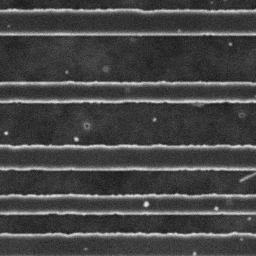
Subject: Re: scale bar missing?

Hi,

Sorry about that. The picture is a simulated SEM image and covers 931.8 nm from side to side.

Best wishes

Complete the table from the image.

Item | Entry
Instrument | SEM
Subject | lines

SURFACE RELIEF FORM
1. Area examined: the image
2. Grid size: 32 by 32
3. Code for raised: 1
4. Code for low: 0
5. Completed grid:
00000000000000000000000000000000
11111111111111111111111111111111
11111111111111111111111111111111
11111111111111111111111111111111
00000000000000000000000000000000
00000000000000000000000000000000
00000000000000000000000000000000
00000000000000000000000000000000
00000000000000000000000000000000
00000000000000000000000000000000
11111111111111111111111111111111
11111111111111111111111111111111
11111111111111111111111111111111
00000000000000000000000000000000
00000000000000000000000000000000
00000000000000000000000000000000
00000000000000000000000000000000
00000000000000000000000000000000
11111111111111111111111111111111
11111111111111111111111111111111
11111111111111111111111111111111
00000000000000000000000000000000
00000000000000000000000000000000
00000000000000000000000000000000
01111011111110111111111111111111
11111111111111111111111111111111
11111111111111111111111111111111
00000000000000000000000000000000
00000000000000000000000000000000
11111111111111111111111111111111
11111111111111111111111111111111
11111111111111111111111111111111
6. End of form